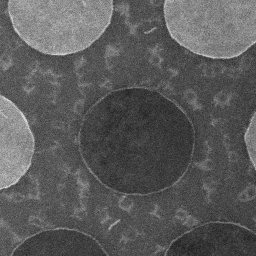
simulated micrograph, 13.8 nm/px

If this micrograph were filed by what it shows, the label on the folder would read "raised bodies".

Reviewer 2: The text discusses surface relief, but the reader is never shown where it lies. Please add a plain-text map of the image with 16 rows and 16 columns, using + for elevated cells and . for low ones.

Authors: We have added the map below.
.++++++...++++++
.++++++...++++++
.+++++.....+++++
.............++.
................
........+.......
+.....+++++.....
++...+++++++....
++...+++++++...+
++...+++++++....
++....++++++....
+.....+++++.....
................
................
...++.......++++
.+++++.....+++++